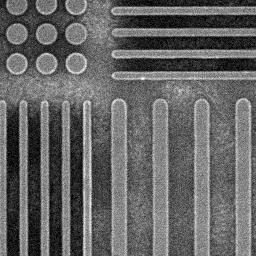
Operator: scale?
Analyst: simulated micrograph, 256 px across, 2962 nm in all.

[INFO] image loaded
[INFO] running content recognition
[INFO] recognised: groups of lines, slits or small figures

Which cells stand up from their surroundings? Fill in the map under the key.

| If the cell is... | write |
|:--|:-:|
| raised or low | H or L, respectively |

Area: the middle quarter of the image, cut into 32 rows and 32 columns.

LHHHHLLLLLLLLLLLLLLLLLLLLLLLLLLL
LHHHHLLLLLLLLLLLLLLLLLLLLLLLLLLL
LLLLLLLLLLLLHHHHHHHHHHHHHHHHHHHH
LLLLLLLLLLLLHHHHHHHHHHHHHHHHHHHH
LLLLLLLLLLLLLLLLLLLLLLLLLLLLLLLL
LLLLLLLLLLLLLLLLLLLLLLLLLLLLLLLL
LLLLLLLLLLLLLLLLLLLLLLLLLLLLLLLL
LLLLLLLLLLLLLLLLLLLLLLLLLLLLLLLL
LLLLLLLLLLLLLLLLLLLLLLLLLLLLLLLL
HLLLLHLLLLLLHHHLLLLLLLLHHHLLLLLL
HLLLLHLLLLLLHHHLLLLLLLHHHHLLLLLL
HLLLLHLLLLLLHHHLLLLLLLHHHHLLLLLL
HLLLLHLLLLLLHHHLLLLLLLHHHHLLLLLL
HLLLLHHLLLLLHHHLLLLLLLHHHHLLLLLL
HLLLLHHLLLLLHHHLLLLLLLHHHHLLLLLL
HLLLLHHLLLLLHHHLLLLLLLHHHHLLLLLL
HLLLLHHLLLLLHHHLLLLLLLHHHHLLLLLL
HLLLLHHLLLLLHHHLLLLLLLHHHHLLLLLL
HLLLLHHLLLLLHHHLLLLLLLHHHHLLLLLL
HLLLLHHLLLLLHHHLLLLLLLHHHHLLLLLL
HLLLLHHLLLLLHHHLLLLLLLHHHHLLLLLL
HLLLLHHLLLLLHHHLLLLLLLHHHHLLLLLL
HLLLLHHLLLLLHHHLLLLLLLHHHHLLLLLL
HLLLLHHLLLLLHHHLLLLLLLHHHHLLLLLL
HLLLLHHLLLLLHHHLLLLLLLHHHHLLLLLL
HLLLLHHLLLLLHHHLLLLLLLHHHHLLLLLL
HLLLLHHLLLLLHHHLLLLLLLHHHHLLLLLL
HLLLLHHLLLLLHHHLLLLLLLHHHHLLLLLL
HLLLLHHLLLLLHHHLLLLLLLHHHHLLLLLL
HLLLLHHLLLLLHHHLLLLLLLHHHHLLLLLL
HLLLLHHLLLLLHHHLLLLLLLHHHHLLLLLL
HLLLLHHLLLLLHHHLLLLLLLHHHHLLLLLL